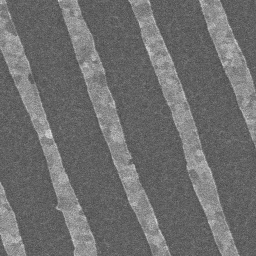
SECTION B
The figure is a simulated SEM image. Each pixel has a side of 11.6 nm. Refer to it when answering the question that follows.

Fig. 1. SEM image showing one or a few lines or trenches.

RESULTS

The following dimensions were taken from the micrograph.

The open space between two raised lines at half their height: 565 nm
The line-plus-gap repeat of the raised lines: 67.1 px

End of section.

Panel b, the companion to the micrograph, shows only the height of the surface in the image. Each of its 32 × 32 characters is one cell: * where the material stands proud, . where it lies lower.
*......***......***......***....
*.......**.......**......***....
*.......**.......**.......**....
**......***.......**......***...
**.......**.......**......***...
***......***......***......***..
***......***.......**......***..
.**.......**.......**.......***.
.***......***......***......***.
..**......***.......**......***.
..**.......**.......***......***
..***......***......***......***
...**......***.......**.......**
...**.......**.......***......**
....**......***.......**.......*
....**.......**.......**.......*
.....*.......**.......***......*
.....**......***.......**.......
.....**.......**.......**.......
......*.......**.......**.......
......**......***......***......
......**.......**.......**......
.......**......**.......***.....
.......**.......**......***.....
*......**.......**.......**.....
*......***......***......***....
**......**.......**.......**....
**......***......***......**....
**.......**.......**......***...
**.......***......**.......**...
.**......***.......**......**...
.**......***.......**.......**..